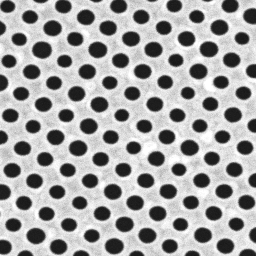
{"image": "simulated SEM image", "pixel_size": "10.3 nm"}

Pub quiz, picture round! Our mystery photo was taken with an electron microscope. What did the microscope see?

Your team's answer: a regular array of holes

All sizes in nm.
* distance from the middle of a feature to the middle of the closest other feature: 250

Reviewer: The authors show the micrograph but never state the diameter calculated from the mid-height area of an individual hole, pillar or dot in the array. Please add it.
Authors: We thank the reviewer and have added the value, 161 nm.